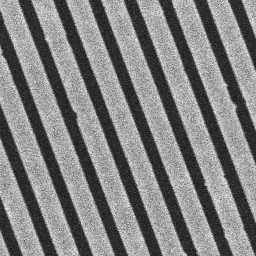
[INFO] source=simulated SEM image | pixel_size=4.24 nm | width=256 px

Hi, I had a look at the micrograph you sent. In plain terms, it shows parallel lines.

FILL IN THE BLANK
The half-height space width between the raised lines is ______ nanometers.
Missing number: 50.5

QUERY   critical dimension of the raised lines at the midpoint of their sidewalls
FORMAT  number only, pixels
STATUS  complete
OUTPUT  21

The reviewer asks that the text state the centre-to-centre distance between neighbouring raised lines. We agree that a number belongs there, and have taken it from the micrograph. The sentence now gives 139 nm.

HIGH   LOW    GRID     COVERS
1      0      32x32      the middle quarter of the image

11100001111100011111100011111100
11110001111110001111100001111100
11110001111110001111110001111110
11111000111110000111110001111110
11111000111111000111111000111110
11111000011111000111111000111111
11111100011111100011111000011111
01111100001111100011111100011111
01111110001111100011111100011111
01111110001111110001111100001111
00111110000111110001111110001111
00111111000111110000111110001111
00011111000111111000111111000111
00011111100011111000111111000111
00011111100011111100011111000011
10001111100001111100011111100011
10001111110001111100001111100011
10001111110001111110001111110001
11000111110000111110001111110001
11000111111000111110000111110001
11000011111000111111000111111000
11100011111100011111000111111000
11100011111100011111100011111000
11110001111100001111100011111100
11110001111110001111110001111100
11110000111110001111110001111110
11111000111111000111110001111110
11111000111111000111110000111110
11111000011111000111111000111111
11111100011111000011111000111111
01111100011111100011111100011111
01111110001111100001111100011111